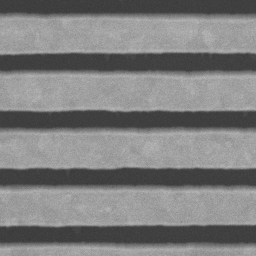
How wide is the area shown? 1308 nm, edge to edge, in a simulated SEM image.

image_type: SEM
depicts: lines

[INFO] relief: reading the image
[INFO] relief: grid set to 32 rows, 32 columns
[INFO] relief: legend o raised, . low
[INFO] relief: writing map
................................
................................
oooooooooooooooooooooooooooooooo
oooooooooooooooooooooooooooooooo
oooooooooooooooooooooooooooooooo
oooooooooooooooooooooooooooooooo
oooooooooooooooooooooooooooooooo
................................
................................
oooooooooooooooooooooooooooooooo
oooooooooooooooooooooooooooooooo
oooooooooooooooooooooooooooooooo
oooooooooooooooooooooooooooooooo
oooooooooooooooooooooooooooooooo
................................
................................
oooooooooooooooooooooooooooooooo
oooooooooooooooooooooooooooooooo
oooooooooooooooooooooooooooooooo
oooooooooooooooooooooooooooooooo
oooooooooooooooooooooooooooooooo
................................
................................
....oo..ooo....o...o............
oooooooooooooooooooooooooooooooo
oooooooooooooooooooooooooooooooo
oooooooooooooooooooooooooooooooo
oooooooooooooooooooooooooooooooo
................................
................................
................................
oooooooooooooooooooooooooooooooo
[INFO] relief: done